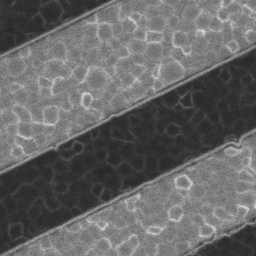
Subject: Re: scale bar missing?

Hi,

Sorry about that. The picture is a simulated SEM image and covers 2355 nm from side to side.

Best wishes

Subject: one or a few lines or trenches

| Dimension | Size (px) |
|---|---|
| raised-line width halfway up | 75.7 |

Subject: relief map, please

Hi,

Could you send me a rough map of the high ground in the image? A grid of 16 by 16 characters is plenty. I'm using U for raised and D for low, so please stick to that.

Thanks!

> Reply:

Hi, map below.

UUUUUUDDDDDDDDDD
UUUUDDDDDDDDDDDD
UUDDDDDDDDDDDDDD
DDDDDDDDDDDDDDDU
DDDDDDDDDDDDDUUU
DDDDDDDDDDDUUUUU
DDDDDDDDDUUUUUUU
DDDDDDDUUUUUUUUU
DDDDDUUUUUUUUUUD
DDDUUUUUUUUUUDDD
DUUUUUUUUUUDDDDD
UUUUUUUUUDDDDDDD
UUUUUUUDDDDDDDDD
UUUUUDDDDDDDDDDD
UUUDDDDDDDDDDDUU
UDDDDDDDDDDDUUUU